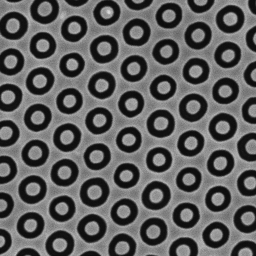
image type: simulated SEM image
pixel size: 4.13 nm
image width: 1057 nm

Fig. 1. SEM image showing a regular array of ring-shaped grooves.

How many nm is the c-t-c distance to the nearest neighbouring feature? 146